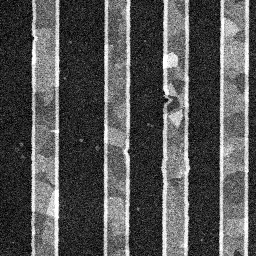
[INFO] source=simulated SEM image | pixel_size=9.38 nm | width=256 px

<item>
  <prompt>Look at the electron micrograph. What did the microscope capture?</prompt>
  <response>one or a few lines or trenches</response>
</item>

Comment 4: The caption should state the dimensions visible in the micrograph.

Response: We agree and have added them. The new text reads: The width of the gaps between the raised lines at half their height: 339 nanometres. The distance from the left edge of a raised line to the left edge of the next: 590 nm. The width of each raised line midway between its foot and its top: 220 nanometres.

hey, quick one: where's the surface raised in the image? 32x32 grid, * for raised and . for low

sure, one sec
....***......***.....**.....***.
....***......***.....**.....***.
....***......***.....**.....***.
....***......***.....**.....***.
....***......***.....**.....***.
....***......***.....**.....***.
....***......***.....**.....***.
....***......***.....**.....***.
....***......***.....**.....***.
....***......***.....**.....***.
....***......***.....**.....***.
....***......***.....**.....***.
....***......***.....**.....***.
....***......***.....**.....***.
....***......***.....**.....***.
....***......***.....**.....***.
....***......***.....**.....***.
....***......***.....**.....***.
....***......***.....**.....***.
....***......***.....**.....***.
....***......***....****....***.
....***......***....***.....***.
....***......***.....**.....***.
....***......***.....**.....***.
....***......***....***.....***.
....***......***.....**.....***.
....***......***.....**.....***.
....***......***.....**.....***.
....***......***.....**.....***.
....***......***.....**.....***.
....***......***.....**.....***.
....***......***.....**.....***.